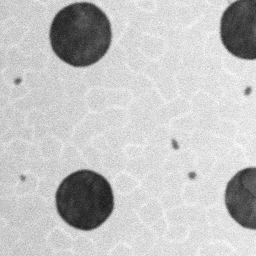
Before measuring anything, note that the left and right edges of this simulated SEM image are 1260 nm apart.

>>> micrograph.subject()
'holes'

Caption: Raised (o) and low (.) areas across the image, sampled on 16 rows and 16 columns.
oooo..oooooooo..
ooo....ooooooo..
ooo....ooooooo..
oooo..ooooooooo.
oooooooooooooooo
oooooooooooooooo
oooooooooooooooo
oooooooooooooooo
oooooooooooooooo
oooooooooooooooo
oooooooooooooooo
oooo...ooooooo..
oooo...ooooooo..
oooo...ooooooo..
oooooooooooooooo
oooooooooooooooo